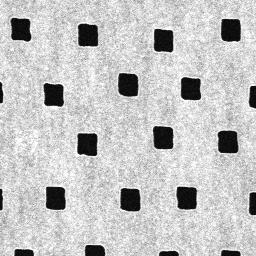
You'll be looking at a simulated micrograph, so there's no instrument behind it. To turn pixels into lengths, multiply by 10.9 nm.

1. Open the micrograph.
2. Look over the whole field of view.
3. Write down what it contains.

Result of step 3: a regular array of holes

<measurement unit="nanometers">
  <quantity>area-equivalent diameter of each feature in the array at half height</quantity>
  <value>258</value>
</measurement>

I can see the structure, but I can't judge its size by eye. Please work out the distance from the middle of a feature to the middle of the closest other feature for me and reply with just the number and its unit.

0.648 micrometres